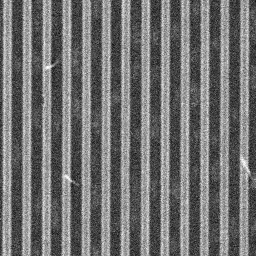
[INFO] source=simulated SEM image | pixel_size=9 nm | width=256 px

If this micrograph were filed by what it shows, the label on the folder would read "parallel lines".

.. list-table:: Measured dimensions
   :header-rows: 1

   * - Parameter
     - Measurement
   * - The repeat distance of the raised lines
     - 0.178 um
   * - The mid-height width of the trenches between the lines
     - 112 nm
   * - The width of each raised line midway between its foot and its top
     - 60.7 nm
